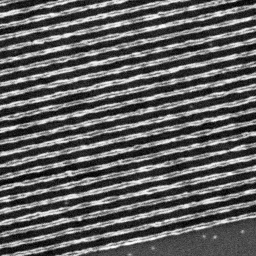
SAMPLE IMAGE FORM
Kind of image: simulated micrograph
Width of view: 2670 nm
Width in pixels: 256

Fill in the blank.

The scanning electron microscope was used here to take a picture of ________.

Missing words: parallel lines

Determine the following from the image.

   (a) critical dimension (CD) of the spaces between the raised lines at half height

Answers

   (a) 86.5 nanometres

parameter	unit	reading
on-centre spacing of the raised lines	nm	118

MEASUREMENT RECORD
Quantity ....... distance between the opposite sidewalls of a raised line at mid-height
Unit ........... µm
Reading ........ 0.0382